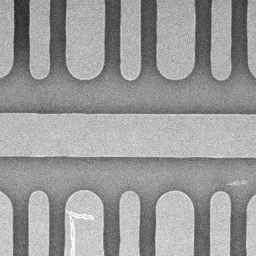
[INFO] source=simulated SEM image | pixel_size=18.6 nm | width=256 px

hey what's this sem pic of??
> groups of lines, slits or small figures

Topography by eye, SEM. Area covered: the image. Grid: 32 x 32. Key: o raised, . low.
oo..oo..ooooo..ooo..oooo...oo..o
oo..oo..ooooo..ooo..oooo..ooo..o
oo..oo..ooooo..ooo..oooo..ooo..o
oo..oo..ooooo..ooo..oooo..ooo..o
oo..oo..ooooo..ooo..oooo..ooo..o
oo..oo..ooooo..ooo..oooo..ooo..o
oo..oo..ooooo..ooo..oooo..ooo..o
oo..oo..ooooo..ooo..oooo..ooo..o
o...oo...oooo..ooo..oooo..ooo..o
o...oo...ooo...oo...ooo....oo...
................................
................................
................................
................................
oooooooooooooooooooooooooooooooo
oooooooooooooooooooooooooooooooo
oooooooooooooooooooooooooooooooo
oooooooooooooooooooooooooooooooo
oooooooooooooooooooooooooooooooo
...oooo.oooooooooooooooooooooooo
................................
................................
................................
................................
o...oo...ooo...oo...ooo....oo...
o...oo..ooooo..oo...oooo..ooo..o
oo..oo..ooooo..oo...oooo..ooo..o
oo..oo..ooooo..oo...oooo..ooo..o
oo..oo..ooooo..oo...oooo..ooo..o
oo..oo..ooooo..oo..ooooo..ooo..o
oo..oo..ooooo..oo..ooooo..ooo..o
oo..oo..ooooo..oo..ooooo..ooo..o